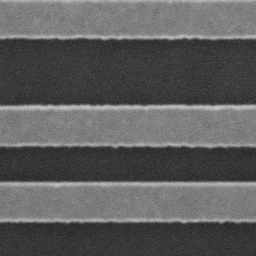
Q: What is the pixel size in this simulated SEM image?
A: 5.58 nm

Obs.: lines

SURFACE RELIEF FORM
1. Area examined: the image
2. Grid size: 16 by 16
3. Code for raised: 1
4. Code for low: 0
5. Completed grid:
1111111111111111
1111111111111111
0000000000000000
0000000000000000
0000000000000000
0000000000000000
0000000000000000
1111111111111111
1111111111111111
0000000000000000
0000000000000000
1111111111111111
1111111111111111
1111111111111111
0000000000000000
0000000000000000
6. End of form